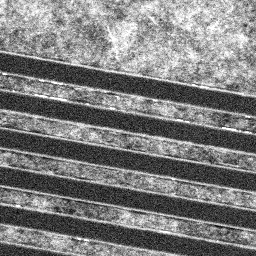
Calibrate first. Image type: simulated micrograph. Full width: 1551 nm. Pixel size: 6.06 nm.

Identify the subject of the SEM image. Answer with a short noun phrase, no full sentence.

parallel lines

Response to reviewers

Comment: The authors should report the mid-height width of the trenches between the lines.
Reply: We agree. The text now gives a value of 16.6 pixels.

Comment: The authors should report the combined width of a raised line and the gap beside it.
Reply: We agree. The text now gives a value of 227 nm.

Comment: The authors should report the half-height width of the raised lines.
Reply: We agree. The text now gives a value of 130 nm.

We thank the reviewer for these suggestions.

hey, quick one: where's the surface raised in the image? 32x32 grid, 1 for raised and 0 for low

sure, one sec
00000000000000000000000000000000
00000000000000000000000000000000
00000000000000000000000000000000
00000000000000000000000000000000
00000000000000000000000000000000
00000000000000000000000000000000
10000000000000000000000000000000
11111100000000000000000000000000
11111111111100000000000000000000
00111111111111111100000000000000
00000000111111111111111000000000
11000000000000111111111111111000
11111111000000000001111111111111
11111111111110000000000001111111
00001111111111111110000000000001
00000000011111111111111110000000
11100000000000011111111111111110
11111111100000000000011111111111
11111111111111100000000000011111
00000111111111111111000000000000
00000000000111111111111111000000
11111000000000000111111111111111
11111111110000000000001111111111
01111111111111110000000000001111
00000001111111111111110000000000
10000000000011111111111111100000
11111100000000000011111111111111
11111111111100000000000111111111
00111111111111111100000000000011
00000000111111111111111000000000
11000000000000111111111111111000
11111110000000000001111111111111